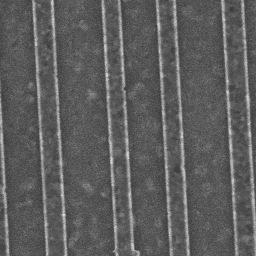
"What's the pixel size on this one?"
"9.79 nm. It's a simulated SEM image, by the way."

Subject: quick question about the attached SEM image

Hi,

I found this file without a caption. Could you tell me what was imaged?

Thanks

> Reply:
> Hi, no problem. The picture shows one or a few lines or trenches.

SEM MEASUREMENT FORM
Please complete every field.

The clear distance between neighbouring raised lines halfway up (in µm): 0.473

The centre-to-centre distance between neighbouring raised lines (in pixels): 63.1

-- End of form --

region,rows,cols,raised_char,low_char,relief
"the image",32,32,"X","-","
----XXX------XX-----XX------XX--
----XXX------XX-----XX------XX--
----XXX------XX-----XX------XX--
----XXX------XX-----XX------XXX-
----XXX------XX-----XX------XXX-
-----XX------XX-----XX------XXX-
-----XX------XX-----XX------XXX-
-----XX------XX-----XX------XXX-
-----XX------XX-----XX------XXX-
-----XX------XX-----XX------XXX-
-----XX------XX-----XX------XXX-
-----XX------XXX----XX------XXX-
-----XX-------XX----XXX------XX-
-----XX------XXX----XXX------XX-
-----XX-------XX----XXX------XX-
-----XX-------XX-----XX------XX-
-----XX-------XX-----XX------XX-
-----XX-------XX-----XX------XX-
-----XXX------XX-----XX------XX-
-----XXX------XX-----XX------XX-
-----XXX------XX-----XX------XX-
-----XXX------XX-----XX------XXX
X----XXX------XX-----XX------XXX
X-----XX------XX-----XX------XXX
X----XXX------XX-----XX------XXX
X-----XX------XX-----XX------XXX
X-----XX------XX-----XX------XXX
X-----XX------XX-----XX------XXX
X-----XX------XX-----XX------XXX
X-----XX------XXX----XX------XXX
X-----XX-------XX----XXX------XX
X-----XX------XXX----XXX------XX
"